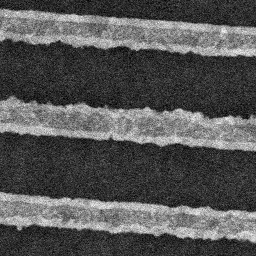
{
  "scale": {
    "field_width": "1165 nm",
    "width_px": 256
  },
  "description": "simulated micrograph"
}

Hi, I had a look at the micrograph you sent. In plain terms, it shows one or a few lines or trenches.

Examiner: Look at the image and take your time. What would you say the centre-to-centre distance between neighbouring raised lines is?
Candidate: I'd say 417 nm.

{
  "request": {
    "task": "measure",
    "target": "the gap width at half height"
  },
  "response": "68.1 pixels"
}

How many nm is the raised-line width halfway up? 106